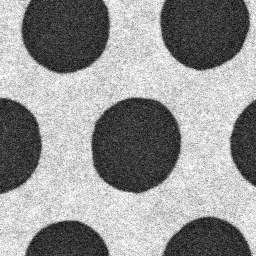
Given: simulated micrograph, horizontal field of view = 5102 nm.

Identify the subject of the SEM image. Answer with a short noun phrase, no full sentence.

holes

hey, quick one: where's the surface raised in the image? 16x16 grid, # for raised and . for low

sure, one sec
##.....###.....#
#......###......
#......###.....#
##....#####....#
###..###########
################
.######...######
..####.....####.
...###.....###..
...###.....###..
..####.....####.
.######...######
################
################
##....#####....#
##.....###......